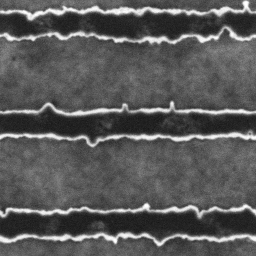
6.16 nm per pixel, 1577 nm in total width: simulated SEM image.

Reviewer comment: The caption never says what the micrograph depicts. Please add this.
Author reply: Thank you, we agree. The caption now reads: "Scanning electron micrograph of one or a few lines or trenches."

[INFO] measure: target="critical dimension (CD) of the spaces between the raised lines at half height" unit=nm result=444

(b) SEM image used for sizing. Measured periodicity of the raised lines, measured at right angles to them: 614 nanometres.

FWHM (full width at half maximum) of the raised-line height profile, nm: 168